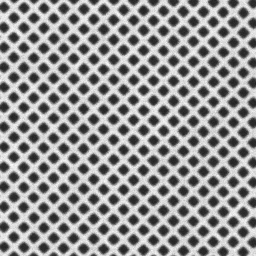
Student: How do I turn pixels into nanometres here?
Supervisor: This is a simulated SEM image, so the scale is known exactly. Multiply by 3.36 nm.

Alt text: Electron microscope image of a regular array of holes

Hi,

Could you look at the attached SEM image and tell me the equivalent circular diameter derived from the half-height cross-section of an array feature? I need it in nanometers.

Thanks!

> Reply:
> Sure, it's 34.6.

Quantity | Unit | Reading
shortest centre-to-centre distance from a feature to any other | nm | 46.2